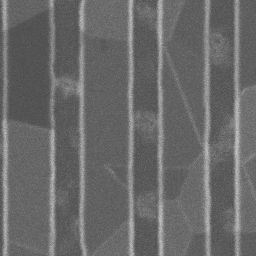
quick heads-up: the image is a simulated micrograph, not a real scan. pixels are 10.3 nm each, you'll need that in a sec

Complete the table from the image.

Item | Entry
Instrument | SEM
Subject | one or a few lines or trenches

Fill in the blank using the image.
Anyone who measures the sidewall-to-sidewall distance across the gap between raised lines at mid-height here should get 302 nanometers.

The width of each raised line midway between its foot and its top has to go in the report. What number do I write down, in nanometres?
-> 494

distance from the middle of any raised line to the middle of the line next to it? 801 nm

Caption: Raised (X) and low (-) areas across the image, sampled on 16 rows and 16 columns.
XXX--XXX--XXX--X
XXX--XXX--XXX--X
XXX--XXX--XXX--X
XXX--XXX--XXX--X
XXX--XXX--XXX--X
XXX--XXX--XXX--X
XXX--XXX--XXX--X
XXX--XXX--XXX--X
XXX--XXX--XXX--X
XXX--XXX--XXX--X
XXX--XXX--XXX--X
XXX--XXX--XXX--X
XXX--XXX--XXX--X
XXX--XXX--XXX--X
XXX--XXX--XXX--X
XXX--XXX--XXX--X